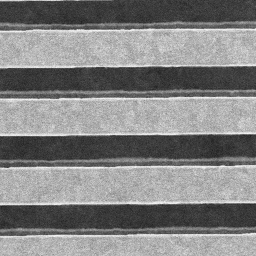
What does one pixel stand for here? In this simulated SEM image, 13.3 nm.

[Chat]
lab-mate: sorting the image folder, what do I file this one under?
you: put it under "lines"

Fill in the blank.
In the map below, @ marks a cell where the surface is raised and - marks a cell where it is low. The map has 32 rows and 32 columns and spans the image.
--------------------------------
--------------------------------
--------------------------------
@@@@@@@@@@@@@@@@@@@@@@@@@@@@@@@@
@@@@@@@@@@@@@@@@@@@@@@@@@@@@@@@@
@@@@@@@@@@@@@@@@@@@@@@@@@@@@@@@@
@@@@@@@@@@@@@@@@@@@@@@@@@@@@@@@@
@@@@@@@@@@@@@@@@@@@@@@@@@@@@@@@@
--------------------------------
--------------------------------
--------------------------------
---------------------@@@@@@@@@@@
@@@@@@@@@@@@@@@@@@@@@@@@@@@@@@@@
@@@@@@@@@@@@@@@@@@@@@@@@@@@@@@@@
@@@@@@@@@@@@@@@@@@@@@@@@@@@@@@@@
@@@@@@@@@@@@@@@@@@@@@@@@@@@@@@@@
@@@@@@@@@@@@@@@@@@@@@@@@@@@@@@@@
--------------------------------
--------------------------------
--------------------------------
@@@@@@@@@@@@@@@@@@@@@@@@@@@@@@@@
@@@@@@@@@@@@@@@@@@@@@@@@@@@@@@@@
@@@@@@@@@@@@@@@@@@@@@@@@@@@@@@@@
@@@@@@@@@@@@@@@@@@@@@@@@@@@@@@@@
@@@@@@@@@@@@@@@@@@@@@@@@@@@@@@@@
@@@@@@@@------------------------
--------------------------------
--------------------------------
--------------------------------
@@@@@@@@@@@@@@@@@@@@@@@@@@@@@@@@
@@@@@@@@@@@@@@@@@@@@@@@@@@@@@@@@
@@@@@@@@@@@@@@@@@@@@@@@@@@@@@@@@